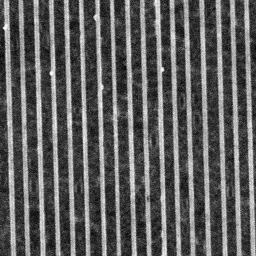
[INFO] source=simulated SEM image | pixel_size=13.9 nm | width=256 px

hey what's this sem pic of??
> parallel lines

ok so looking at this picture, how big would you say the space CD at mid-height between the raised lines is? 164 nanometres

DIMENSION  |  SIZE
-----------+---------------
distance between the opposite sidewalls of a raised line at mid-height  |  3.87 px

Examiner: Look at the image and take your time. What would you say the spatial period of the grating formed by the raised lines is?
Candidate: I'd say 0.208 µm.